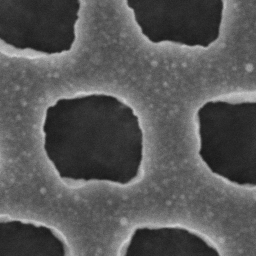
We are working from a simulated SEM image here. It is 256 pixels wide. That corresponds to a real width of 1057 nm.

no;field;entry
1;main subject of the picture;holes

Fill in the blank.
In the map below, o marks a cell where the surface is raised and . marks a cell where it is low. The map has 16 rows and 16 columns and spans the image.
.....ooo......oo
.....oooo.....oo
.....oooo....ooo
oooooooooooooooo
oooooooooooooooo
oooooooooooooooo
ooo.....ooooo...
ooo......ooo....
ooo......oooo...
ooo......oooo...
ooo......oooo...
ooooooooooooooo.
oooooooooooooooo
oooooooooooooooo
...ooooo....oooo
....oooo.....ooo